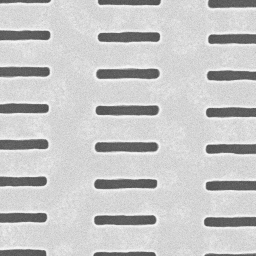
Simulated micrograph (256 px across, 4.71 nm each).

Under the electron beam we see holes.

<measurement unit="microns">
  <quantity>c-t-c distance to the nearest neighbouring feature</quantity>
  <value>0.172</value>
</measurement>